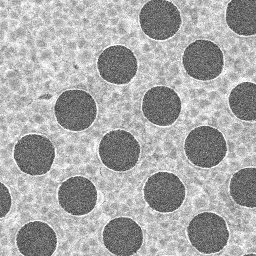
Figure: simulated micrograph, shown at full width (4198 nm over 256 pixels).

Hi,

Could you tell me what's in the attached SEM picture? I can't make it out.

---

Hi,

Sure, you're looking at a regular array of holes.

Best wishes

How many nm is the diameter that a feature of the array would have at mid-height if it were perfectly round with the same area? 691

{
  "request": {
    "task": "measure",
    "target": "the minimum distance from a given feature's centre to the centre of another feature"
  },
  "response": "981 nm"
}